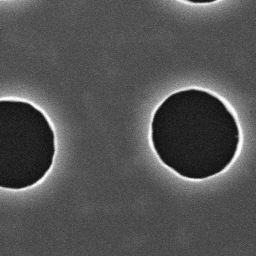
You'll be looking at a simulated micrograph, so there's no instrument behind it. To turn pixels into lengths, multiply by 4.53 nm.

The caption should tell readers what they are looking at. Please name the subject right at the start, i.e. holes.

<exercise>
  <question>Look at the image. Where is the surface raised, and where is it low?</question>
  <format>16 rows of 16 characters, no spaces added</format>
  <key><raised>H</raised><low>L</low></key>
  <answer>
HHHHHHHHHHHHHHHH
HHHHHHHHHHHHHHHH
HHHHHHHHHHHHHHHH
HHHHHHHHHHHHHHHH
HHHHHHHHHHHHHHHH
HHHHHHHHHHHHHHHH
LLHHHHHHHHLLLLHH
LLLHHHHHHHLLLLLH
LLLHHHHHHLLLLLLH
LLLHHHHHHHLLLLLH
LLLHHHHHHHHLLLHH
LLHHHHHHHHHHHHHH
HHHHHHHHHHHHHHHH
HHHHHHHHHHHHHHHH
HHHHHHHHHHHHHHHH
HHHHHHHHHHHHHHHH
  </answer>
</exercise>